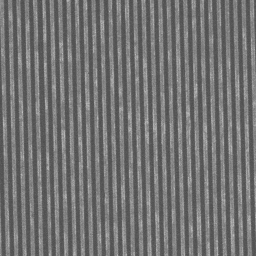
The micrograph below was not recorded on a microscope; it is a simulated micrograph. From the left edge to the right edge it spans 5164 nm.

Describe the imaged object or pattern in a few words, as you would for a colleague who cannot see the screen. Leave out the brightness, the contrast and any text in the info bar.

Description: parallel lines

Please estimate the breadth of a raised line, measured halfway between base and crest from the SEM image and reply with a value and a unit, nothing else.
0.068 µm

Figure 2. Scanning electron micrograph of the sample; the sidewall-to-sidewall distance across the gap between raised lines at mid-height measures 0.106 microns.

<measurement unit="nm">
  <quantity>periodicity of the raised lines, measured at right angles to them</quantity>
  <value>168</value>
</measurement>